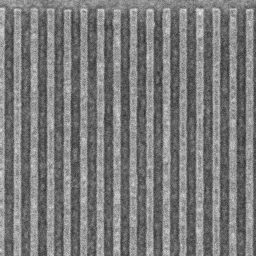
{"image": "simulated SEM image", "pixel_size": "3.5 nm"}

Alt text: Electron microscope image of parallel lines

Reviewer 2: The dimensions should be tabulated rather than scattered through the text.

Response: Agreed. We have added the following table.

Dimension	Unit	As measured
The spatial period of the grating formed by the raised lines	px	16.6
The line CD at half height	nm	23.2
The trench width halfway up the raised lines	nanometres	36.3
